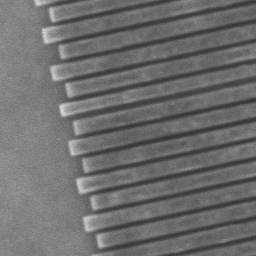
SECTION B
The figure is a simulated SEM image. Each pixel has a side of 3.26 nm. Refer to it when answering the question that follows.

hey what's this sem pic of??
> parallel lines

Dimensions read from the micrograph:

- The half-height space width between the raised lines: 17.1 nanometers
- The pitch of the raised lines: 63.2 nanometers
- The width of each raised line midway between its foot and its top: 46.3 nm